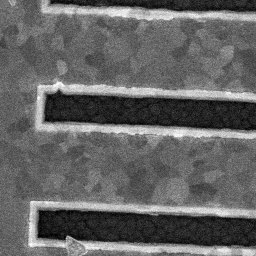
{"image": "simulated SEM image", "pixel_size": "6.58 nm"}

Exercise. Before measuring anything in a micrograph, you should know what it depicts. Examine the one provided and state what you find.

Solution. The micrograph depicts one or a few lines or trenches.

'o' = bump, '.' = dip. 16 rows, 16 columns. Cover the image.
ooo.............
oooooooooooooooo
oooooooooooooooo
oooooooooooooooo
oooooooooooooooo
ooo.oooooooooooo
oo..............
oo..............
oooooooooooooooo
oooooooooooooooo
oooooooooooooooo
oooooooooooooooo
oooooooooooooooo
oo..............
oo..............
oooooooo........